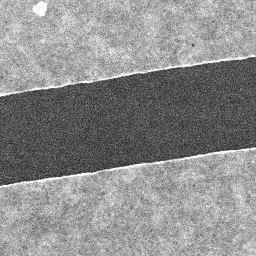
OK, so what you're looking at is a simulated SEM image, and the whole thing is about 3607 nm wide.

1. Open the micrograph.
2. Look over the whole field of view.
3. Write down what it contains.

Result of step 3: one or a few lines or trenches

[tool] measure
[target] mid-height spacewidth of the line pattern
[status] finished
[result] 1.27 um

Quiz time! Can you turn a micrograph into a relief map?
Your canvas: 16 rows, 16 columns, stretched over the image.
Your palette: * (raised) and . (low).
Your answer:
****************
****************
****************
****************
*********.......
***.............
................
................
................
..............**
.......*********
.***************
****************
****************
.***************
****************